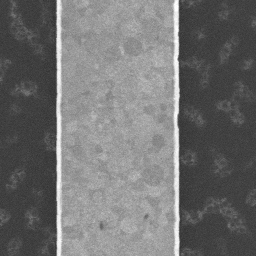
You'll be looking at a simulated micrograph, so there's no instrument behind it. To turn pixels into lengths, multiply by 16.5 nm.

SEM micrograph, one or a few lines or trenches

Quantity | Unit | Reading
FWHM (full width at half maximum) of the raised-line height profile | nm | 1940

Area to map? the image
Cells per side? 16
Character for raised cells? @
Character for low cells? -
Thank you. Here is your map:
----@@@@@@@-----
----@@@@@@@-----
----@@@@@@@-----
----@@@@@@@-----
----@@@@@@@-----
----@@@@@@@-----
----@@@@@@@-----
----@@@@@@@-----
----@@@@@@@-----
----@@@@@@@-----
----@@@@@@@-----
----@@@@@@@-----
----@@@@@@@-----
----@@@@@@@-----
----@@@@@@@-----
----@@@@@@@-----